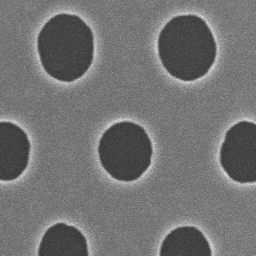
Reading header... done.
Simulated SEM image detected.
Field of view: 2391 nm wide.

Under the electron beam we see holes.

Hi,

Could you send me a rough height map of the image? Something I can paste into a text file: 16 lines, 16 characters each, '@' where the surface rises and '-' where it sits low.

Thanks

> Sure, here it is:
@@@@@@@@@@@@@@@@
@@@--@@@@@---@@@
@@----@@@@---@@@
@@----@@@@---@@@
@@@--@@@@@@--@@@
@@@@@@@@@@@@@@@@
@@@@@@@@@@@@@@@@
@@@@@@@@@@@@@@@@
--@@@@---@@@@@--
--@@@@----@@@@--
--@@@@---@@@@@--
@@@@@@@@@@@@@@@@
@@@@@@@@@@@@@@@@
@@@@@@@@@@@@@@@@
@@@--@@@@@@--@@@
@@---@@@@@---@@@